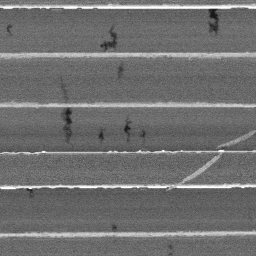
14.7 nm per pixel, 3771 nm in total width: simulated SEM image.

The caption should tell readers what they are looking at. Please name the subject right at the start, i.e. lines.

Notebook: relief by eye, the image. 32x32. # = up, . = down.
################################
................................
................................
................................
................................
................................
................................
################################
################################
################################
################################
################################
################################
................................
................................
................................
................................
................................
................................
################################
################################
################################
################################
................................
................................
................................
................................
................................
................................
######...#######################
################################
################################